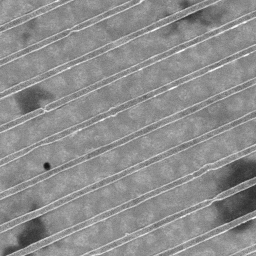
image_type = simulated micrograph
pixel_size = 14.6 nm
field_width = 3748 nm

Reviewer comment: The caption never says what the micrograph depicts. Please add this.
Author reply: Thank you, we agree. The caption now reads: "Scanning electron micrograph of parallel lines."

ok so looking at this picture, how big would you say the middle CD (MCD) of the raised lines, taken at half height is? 96.7 nm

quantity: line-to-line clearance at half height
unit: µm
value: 0.348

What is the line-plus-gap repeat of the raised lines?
445 nanometers